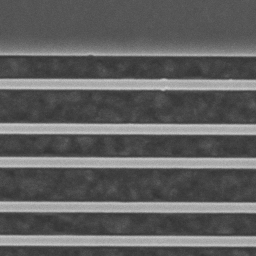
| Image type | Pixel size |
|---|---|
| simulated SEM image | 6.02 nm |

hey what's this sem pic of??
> parallel lines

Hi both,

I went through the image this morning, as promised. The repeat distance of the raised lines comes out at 236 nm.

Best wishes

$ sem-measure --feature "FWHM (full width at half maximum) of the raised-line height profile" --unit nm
62.5